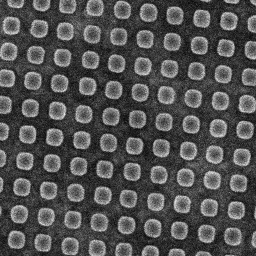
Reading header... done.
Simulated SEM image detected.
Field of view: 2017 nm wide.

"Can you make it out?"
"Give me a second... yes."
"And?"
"a regular array of raised bodies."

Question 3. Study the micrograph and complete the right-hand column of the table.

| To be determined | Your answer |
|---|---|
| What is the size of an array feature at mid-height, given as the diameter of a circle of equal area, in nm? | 140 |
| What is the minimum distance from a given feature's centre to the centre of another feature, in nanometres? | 207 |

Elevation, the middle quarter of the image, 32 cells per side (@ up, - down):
@----@@@---@@@@---@@@@--@@@@---@
------------@@@---@@@@--@@@@---@
-------------------@@----@@@---@
@----@--------------------------
@---@@@@---@@-------------------
@---@@@@---@@@---@@@@-----------
----@@@@---@@@---@@@@---@@@----@
-----@@---@@@@---@@@@---@@@---@@
------------@@---@@@@---@@@---@@
------------------------@@@---@@
----@--------------------------@
---@@@@---@@@-------------------
---@@@@---@@@@---@@@----@@------
---@@@@---@@@@--@@@@---@@@@---@@
----@@----@@@@--@@@@---@@@@---@@
-----------------@@@---@@@@---@@
------------------------@@----@@
---@@@--------------------------
---@@@---@@@@---@@--------------
--@@@@---@@@@---@@@@---@@@----@-
---@@@---@@@@---@@@---@@@@---@@@
----------@@@---@@@---@@@@---@@@
------------------@----@@@---@@@
---@--------------------------@@
--@@@@---@@---------------------
--@@@@--@@@@---@@@@-------------
--@@@---@@@@---@@@@---@@@@---@@@
--@@@----@@@---@@@@---@@@@---@@@
---------------@@@@---@@@@--@@@@
----------------------@@@---@@@@
-@@@@--------------------------@
-@@@@---@@@@--------------------